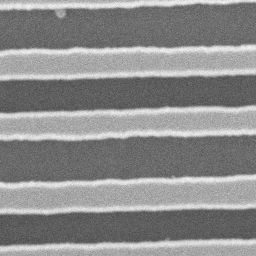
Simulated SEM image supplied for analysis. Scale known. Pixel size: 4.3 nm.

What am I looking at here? lines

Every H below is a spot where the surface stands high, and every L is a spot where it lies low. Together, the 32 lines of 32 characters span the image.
HHHHHHHHHHHHHHHHHHHHHHHLLLLLLLLL
LLLLLLLLLLLLLLLLLLLLLLLLLLLLLLLL
LLLLLLLLLLLLLLLLLLLLLLLLLLLLLLLL
LLLLLLLLLLLLLLLLLLLLLLLLLLLLLLLL
LLLLLLLLLLLLLLLLLLLLLLLLLLLLLLLL
LLLLLLLLLLLLLLLLLLLLLLLLLLLLLLLL
HHHHHHHHHHHHHHHHHHHHHHHHHHHHHHHH
HHHHHHHHHHHHHHHHHHHHHHHHHHHHHHHH
HHHHHHHHHHHHHHHHHHHHHHHHHHHHHHHH
HHHHHHHHHHHHHHHHHHHHHHHHLLLLLLLL
LLLLLLLLLLLLLLLLLLLLLLLLLLLLLLLL
LLLLLLLLLLLLLLLLLLLLLLLLLLLLLLLL
LLLLLLLLLLLLLLLLLLLLLLLLLLLLLLLL
LLLLLLLLLLLLLLLLLLLLHHHHHHHHHHHH
HHHHHHHHHHHHHHHHHHHHHHHHHHHHHHHH
HHHHHHHHHHHHHHHHHHHHHHHHHHHHHHHH
HHHHHHHHHHHHHHHHHHHHHHHHHHHHHHHH
HLLLHLLLHHLLLLLLLLLLLLLLLLLLLLLL
LLLLLLLLLLLLLLLLLLLLLLLLLLLLLLLL
LLLLLLLLLLLLLLLLLLLLLLLLLLLLLLLL
LLLLLLLLLLLLLLLLLLLLLLLLLLLLLLLL
LLLLLLLLLLLLLLLLLLLLLLLLLLLLLLLL
LLLLLLLLLLLLLHHLHHHHHHHHHHHHHHHH
HHHHHHHHHHHHHHHHHHHHHHHHHHHHHHHH
HHHHHHHHHHHHHHHHHHHHHHHHHHHHHHHH
HHHHHHHHHHHHHHHHHHHHHHHHHHHHHHHH
HHHHHHHHHLLLLLLLLLLLLLLLLLLLLLLL
LLLLLLLLLLLLLLLLLLLLLLLLLLLLLLLL
LLLLLLLLLLLLLLLLLLLLLLLLLLLLLLLL
LLLLLLLLLLLLLLLLLLLLLLLLLLLLLLLL
LLLLLLLLLLLLHHHHHHHHHHHHHHHHHHHH
HHHHHHHHHHHHHHHHHHHHHHHHHHHHHHHH